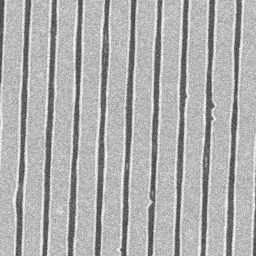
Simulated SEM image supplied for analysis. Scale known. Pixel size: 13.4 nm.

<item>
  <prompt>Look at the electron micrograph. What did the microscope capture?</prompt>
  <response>parallel lines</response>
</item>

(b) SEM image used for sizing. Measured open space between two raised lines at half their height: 92 nm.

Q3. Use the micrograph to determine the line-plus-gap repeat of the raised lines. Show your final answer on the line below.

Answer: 353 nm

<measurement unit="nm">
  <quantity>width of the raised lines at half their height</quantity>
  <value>254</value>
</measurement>